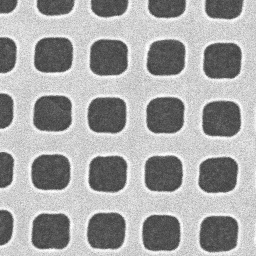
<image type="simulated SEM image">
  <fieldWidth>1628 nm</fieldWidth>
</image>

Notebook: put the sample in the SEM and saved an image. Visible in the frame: a regular array of holes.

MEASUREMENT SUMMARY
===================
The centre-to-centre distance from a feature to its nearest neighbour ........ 352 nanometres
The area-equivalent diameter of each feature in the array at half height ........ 258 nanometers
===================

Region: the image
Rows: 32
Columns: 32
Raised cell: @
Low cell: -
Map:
--@@@----@@-----@@-----@@@----@@
-@@@@----@@@----@@@----@@@----@@
@@@@@@@@@@@@@@@@@@@@@@@@@@@@@@@@
@@@@@@@@@@@@@@@@@@@@@@@@@@@@@@@@
@@@@@@@@@@@@@@@@@@@@@@@@@@@@@@@@
--@@@----@@@----@@@----@@@@---@@
--@@-----@@-----@@-----@@-----@@
--@@-----@@-----@@-----@@-----@@
--@@-----@@-----@@-----@@-----@@
@@@@@@@@@@@@@@@@@@@--@@@@@----@@
@@@@@@@@@@@@@@@@@@@@@@@@@@@@@@@@
@@@@@@@@@@@@@@@@@@@@@@@@@@@@@@@@
--@@@----@@@---@@@@----@@@@-@@@@
--@@-----@@-----@@-----@@-----@@
--@@-----@@-----@@-----@@-----@@
-@@@-----@@-----@@-----@@-----@@
@@@@@@@@@@@@---@@@@---@@@-----@@
@@@@@@@@@@@@@@@@@@@@@@@@@@@@@@@@
@@@@@@@@@@@@@@@@@@@@@@@@@@@@@@@@
--@@@---@@@@@--@@@@---@@@@@@@@@@
--@@-----@@-----@@-----@@-----@@
--@@-----@@-----@@-----@@-----@@
--@@-----@@-----@@-----@@-----@@
-@@@@---@@@----@@@----@@@----@@@
@@@@@@@@@@@@@@@@@@@@@@@@@@@@@@@@
@@@@@@@@@@@@@@@@@@@@@@@@@@@@@@@@
-@@@@@@@@@@@@@@@@@@@@@@@@@@@@@@@
--@@-----@@-----@@----@@@----@@@
--@@-----@@-----@@-----@@-----@@
--@@-----@@-----@@-----@@-----@@
-@@@-----@@----@@@----@@@-----@@
@@@@@@@@@@@@@@@@@@@@@@@@@@--@@@@